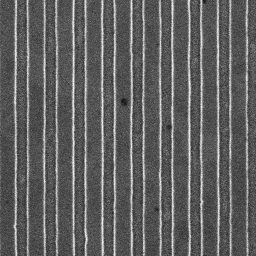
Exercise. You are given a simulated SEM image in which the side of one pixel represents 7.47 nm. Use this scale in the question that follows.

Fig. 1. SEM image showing parallel lines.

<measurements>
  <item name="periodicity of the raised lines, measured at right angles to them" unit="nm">216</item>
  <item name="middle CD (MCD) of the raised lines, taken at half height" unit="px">17.4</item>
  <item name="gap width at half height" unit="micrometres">0.0878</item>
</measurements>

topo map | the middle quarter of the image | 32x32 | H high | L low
HHLLLHHHHLLLLHHHHLLLHHHHLLLHHHHL
HHLLLHHHHLLLLHHHHLLLHHHHLLLHHHHL
HHLLLHHHHLLLLHHHHLLLHHHHLLLHHHHL
HHLLLHHHHHLLLHHHHLLLHHHHLLLHHHHL
HHLLLHHHHHLLLHHHHLLLHHHHLLLHHHHL
HHLLLHHHHHLLLHHHHLLLHHHHLLLHHHHL
HHLLLHHHHHLLLHHHHLLLHHHHLLLHHHHL
HHLLLHHHHHLLLHHHHLLLHHHHLLLHHHHL
HHLLLHHHHHLLLHHHHLLLHHHHLLLHHHHL
HHLLLHHHHHLLLHHHHLLLHHHHLLLHHHHL
HHLLLHHHHHLLLHHHHLLLHHHHLLLHHHHL
HHLLLHHHHHLLLHHHHLLLHHHHLLLHHHHL
HHLLLHHHHHLLLHHHHLLLHHHHLLLHHHHL
HHLLLHHHHHLLLHHHHLLLHHHHLLLHHHHL
HHLLLHHHHHLLLHHHHLLLHHHHLLLHHHHL
HHLLLHHHHHLLLHHHHLLLHHHHLLLHHHHL
HHLLLHHHHHLLLHHHHLLLHHHHLLLHHHHL
HHLLLHHHHHLLLHHHHLLLHHHHLLLHHHHL
HHLLLHHHHHLLLHHHHLLLHHHHLLLHHHHL
HHLLLHHHHHLLLHHHHLLLHHHHLLLHHHHL
HHLLLHHHHHLLLHHHHLLLHHHHLLLHHHHL
HHLLLHHHHHLLLHHHHLLLHHHHLLLHHHHL
HHLLLHHHHHLLLHHHHLLLHHHHLLLHHHHL
HHLLLHHHHHLLLHHHHLLLHHHHLLLHHHHL
HHLLLHHHHHLLLHHHHLLLHHHHLLLHHHHL
HHLLLHHHHHLLLHHHHLLLHHHHLLLHHHHL
HHLLLHHHHHLLLHHHHLLLHHHHLLLHHHHL
HHLLLHHHHHLLLHHHHLLLHHHHLLLHHHHL
HHLLLHHHHHLLLHHHHLLLHHHHLLLHHHHL
HHLLLHHHHHLLLHHHHLLLHHHHLLLHHHHL
HHLLLHHHHHLLLHHHHLLLHHHHLLLHHHHL
HHLLLHHHHHLLLHHHHLLLHHHHLLLHHHHL